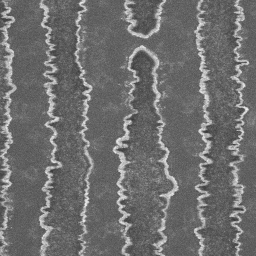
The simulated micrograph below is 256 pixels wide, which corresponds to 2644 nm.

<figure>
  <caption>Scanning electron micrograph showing one or a few lines or trenches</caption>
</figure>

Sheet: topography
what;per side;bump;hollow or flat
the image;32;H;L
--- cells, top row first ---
LHHHHLLLLLHHHHHHLLLLHHHHHLLLLHHH
LHHHHHLLLLHHHHHHLLLLHHHHHLLLLLHH
LHHHHHLLLLHHHHHHHLLLHHHHHLLLLLHH
HHHHHHLLLLHHHHHHHLLHHHHHHLLLLLHH
LHHHHHLLLLHHHHHHHHHHHHHHHLLLLHHH
LHHHHHLLLLHHHHHHHHHHHHHHHLLLLLHH
LHHHHHLLLLHHHHHHHLHHHHHHHLLLLHHH
LHHHHHLLLLHHHHHHHLLHHHHHHHLLLLHH
LHHHHHHLLLHHHHHHHLLHHHHHHHLLLLHH
LHHHHHLLLLHHHHHHHLLHHHHHHHLLLHHH
LHHHHHHLLLLHHHHHHLLHHHHHHHLLLLHH
LHHHHHLLLLLHHHHHHLLHHHHHHHLLLLHH
LHHHHHHLLLLHHHHHHLLHHHHHHHLLLLHH
LHHHHHHLLLLHHHHHHLLLHHHHHHLLLLHH
LHHHHHHLLLLHHHHHLLLLHHHHHHLLLLHH
LHHHHHHLLLHHHHHHLLLLHHHHHHLLLLHH
LHHHHHHLLLHHHHHHLLLLHHHHHHLLLLHH
LHHHHHHLLLLHHHHHLLLLHHHHHHLLLLHH
LHHHHHHLLLLHHHHLLLLLHHHHHHLLLHHH
HHHHHHHLLLLHHHHLLLLLLHHHHHLLLLHH
LHHHHHHLLLLHHHHHLLLLLHHHHHLLLHHH
LHHHHHLLLLLHHHHLLLLLLHHHHLLLLHHH
LHHHHHLLLLLHHHHLLLLLLHHHHHLLLHHH
HHHHHHLLLLLHHHHLLLLLLLHHHLLLLLHH
HHHHHHLLLLLHHHHLLLLLLHHHHHLLLLHH
HHHHHHLLLLLHHHHLLLLLLHHHHLLLLLHH
LHHHHHLLLLHHHHHHLLLLLHHHHLLLLLHH
LHHHHLLLLLHHHHHHLLLLHHHHHLLLLHHH
HHHHHHLLLLHHHHHHLLLLHHHHHLLLLLHH
HHHHHHLLLLHHHHHHLLLLHHHHHLLLLLHH
HHHHHHLLLLHHHHHHLLLLHHHHHLLLLHHH
HHHHHLLLLLHHHHHHLLLLHHHHHLLLLLHH